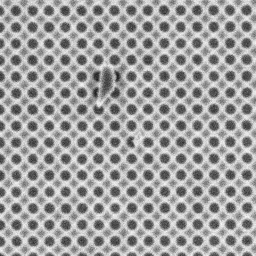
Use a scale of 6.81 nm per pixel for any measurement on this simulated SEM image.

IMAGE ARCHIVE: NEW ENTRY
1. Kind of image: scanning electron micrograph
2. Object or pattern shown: a regular array of holes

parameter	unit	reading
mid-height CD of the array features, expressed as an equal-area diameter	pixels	11.7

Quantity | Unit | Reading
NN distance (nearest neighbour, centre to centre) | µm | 0.111